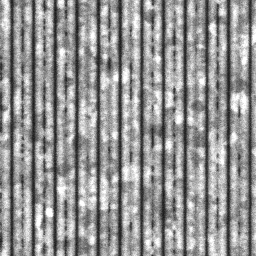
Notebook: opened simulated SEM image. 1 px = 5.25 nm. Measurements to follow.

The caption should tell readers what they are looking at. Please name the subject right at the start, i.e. parallel lines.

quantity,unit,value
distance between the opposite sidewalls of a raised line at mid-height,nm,41.4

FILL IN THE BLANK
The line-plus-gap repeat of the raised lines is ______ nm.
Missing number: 56.8